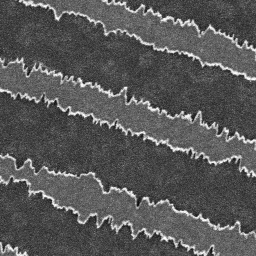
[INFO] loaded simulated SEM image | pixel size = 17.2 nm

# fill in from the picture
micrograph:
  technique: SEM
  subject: one or a few lines or trenches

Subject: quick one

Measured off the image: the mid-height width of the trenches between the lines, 1.02 um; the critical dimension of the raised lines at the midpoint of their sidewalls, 30.4 px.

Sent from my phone